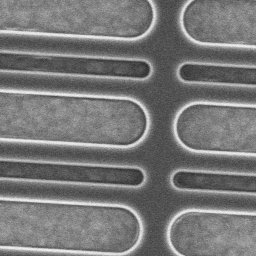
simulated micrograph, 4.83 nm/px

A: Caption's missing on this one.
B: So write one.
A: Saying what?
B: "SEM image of groups of lines, slits or small figures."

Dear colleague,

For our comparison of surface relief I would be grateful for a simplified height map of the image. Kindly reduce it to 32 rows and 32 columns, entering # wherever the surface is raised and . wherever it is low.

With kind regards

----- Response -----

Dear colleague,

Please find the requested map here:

...................#####........
...................####.........
...................####.........
...................####.........
#########.........######........
###########################.....
################################
................################
...................####.........
############......####..........
############################....
.###############################
................################
..................#####.........
..................####..........
..................####..........
..................####..........
##...............#####..........
#######################.........
################################
.........#######################
..................####...#######
#####.............####..........
######################..........
################################
..........######################
.................######.....####
.................#####..........
..................###...........
.................####...........
.................####...........
##########......######..........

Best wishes